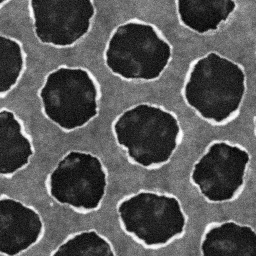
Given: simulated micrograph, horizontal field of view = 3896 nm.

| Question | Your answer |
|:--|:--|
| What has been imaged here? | holes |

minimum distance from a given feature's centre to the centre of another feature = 1250 nm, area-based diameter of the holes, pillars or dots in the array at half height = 898 nanometers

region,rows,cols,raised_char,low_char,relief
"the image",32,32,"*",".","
****........**********.......***
****........**********.......***
****.......************.....****
****.......****....*****...*****
*****.....****......************
..*****..*****.......***********
...**********........***********
...**********........****...****
...***********.......***......**
..****.....****.....****.......*
..****......***********........*
.****.......***********........*
*****.......***********.......**
******......*****...****......**
..****......***.......***....***
..*****....***........**********
...***********........**********
....***********.......**********
....************......****....**
....****....****.....****......*
...****......*****..*****......*
..*****......***********.......*
******.......***********......**
******.......************.....**
*******......****....*****...***
...******...***.......**********
....***********........*********
.....**********........*********
.....***********.......***.....*
.....****...*****.....****......
....****......****...****.......
..*****.......***********.......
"